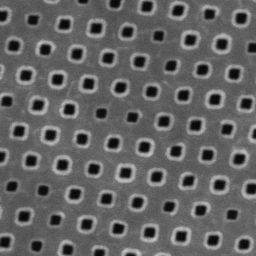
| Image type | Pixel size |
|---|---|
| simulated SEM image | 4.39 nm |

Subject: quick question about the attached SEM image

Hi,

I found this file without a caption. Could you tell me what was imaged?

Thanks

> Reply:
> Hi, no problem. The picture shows a regular array of holes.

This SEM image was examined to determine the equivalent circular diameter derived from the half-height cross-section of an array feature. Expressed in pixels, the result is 11.7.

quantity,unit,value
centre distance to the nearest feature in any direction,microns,0.138